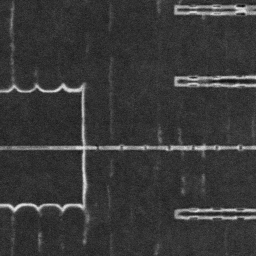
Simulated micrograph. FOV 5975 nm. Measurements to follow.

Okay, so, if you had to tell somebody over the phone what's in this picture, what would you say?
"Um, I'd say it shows wiring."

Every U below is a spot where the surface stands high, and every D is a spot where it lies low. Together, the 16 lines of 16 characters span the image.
UUUUUUUUUUUUUUUU
UUUUUUUUUUUUUUUU
UUUUUUUUUUUUUUUU
UUUUUUUUUUUUUUUU
UUUUUUUUUUUUUUUU
UUUUUUUUUUUUUUUU
DDDDDUUUUUUUUUUU
DDDDDUUUUUUUUUUU
DDDDDUUUUUUUUUUU
DDDDDUUUUUUUUUUU
DDDDDUUUUUUUUUUU
DDDDDUUUUUUUUUUU
DDDDDUUUUUUUUUUU
UUUUUUUUUUUUUUUU
UUUUUUUUUUUUUUUU
UUUUUUUUUUUUUUUU